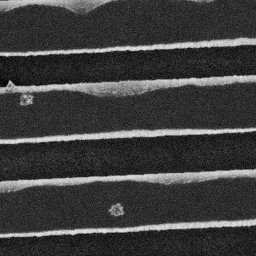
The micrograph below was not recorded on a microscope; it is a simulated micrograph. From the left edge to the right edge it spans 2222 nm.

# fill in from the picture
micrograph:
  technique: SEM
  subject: lines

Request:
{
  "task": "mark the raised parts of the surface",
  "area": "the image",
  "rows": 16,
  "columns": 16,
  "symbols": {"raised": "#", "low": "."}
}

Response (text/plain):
################
################
################
................
................
#.##############
################
################
#######.........
................
................
################
################
################
#####...........
................